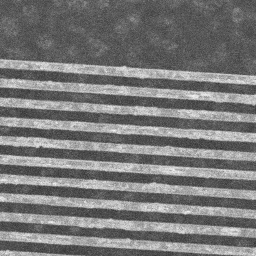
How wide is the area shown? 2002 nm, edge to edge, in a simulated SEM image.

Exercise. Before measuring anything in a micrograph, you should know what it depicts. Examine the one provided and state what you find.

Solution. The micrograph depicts parallel lines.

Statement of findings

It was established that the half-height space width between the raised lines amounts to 85.8 nm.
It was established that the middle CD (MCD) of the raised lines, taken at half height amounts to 59.5 nm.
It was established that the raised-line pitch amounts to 149 nanometres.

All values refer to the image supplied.